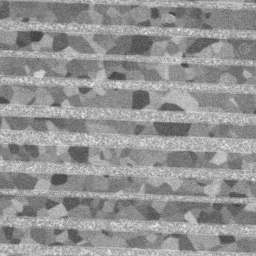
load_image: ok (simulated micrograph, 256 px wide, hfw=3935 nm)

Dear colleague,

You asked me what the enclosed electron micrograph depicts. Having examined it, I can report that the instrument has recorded parallel lines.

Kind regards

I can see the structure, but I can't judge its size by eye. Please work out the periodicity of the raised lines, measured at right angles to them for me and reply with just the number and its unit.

430 nanometres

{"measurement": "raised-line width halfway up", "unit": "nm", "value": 309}